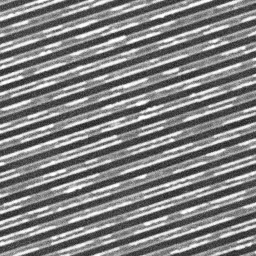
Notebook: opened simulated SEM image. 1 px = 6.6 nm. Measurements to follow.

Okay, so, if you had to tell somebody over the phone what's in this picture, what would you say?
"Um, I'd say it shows parallel lines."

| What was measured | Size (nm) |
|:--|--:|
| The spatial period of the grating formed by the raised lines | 101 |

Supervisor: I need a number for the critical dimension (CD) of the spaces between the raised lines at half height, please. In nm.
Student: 47.8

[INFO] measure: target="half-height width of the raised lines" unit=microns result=0.0542